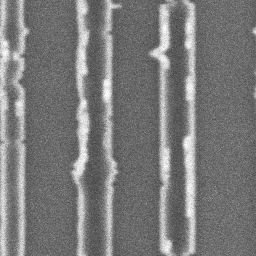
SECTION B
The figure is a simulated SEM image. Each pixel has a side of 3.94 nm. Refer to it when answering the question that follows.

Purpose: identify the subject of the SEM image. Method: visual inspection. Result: one or a few lines or trenches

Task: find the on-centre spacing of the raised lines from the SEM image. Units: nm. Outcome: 326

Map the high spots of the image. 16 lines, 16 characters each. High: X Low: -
X----XX---XX----
X----XX---XX----
X----XX---XX----
X----XX---XX----
X----XX---XX----
X----XX---XX----
X----XX---XX----
X----XX---XX----
X----XX---XX----
X----XX---XX----
X----XX---XX----
X----XX---XX----
X----XX---XX----
X----XX---XX----
X----XX---XX----
X----XX---XX----